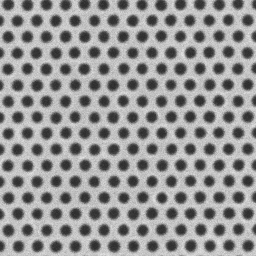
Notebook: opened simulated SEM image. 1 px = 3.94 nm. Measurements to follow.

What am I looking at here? a regular array of holes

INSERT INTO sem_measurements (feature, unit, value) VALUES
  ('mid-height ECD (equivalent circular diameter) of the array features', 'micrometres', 0.0458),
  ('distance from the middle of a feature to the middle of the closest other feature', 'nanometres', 72.6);